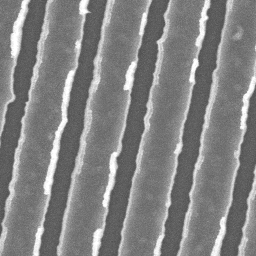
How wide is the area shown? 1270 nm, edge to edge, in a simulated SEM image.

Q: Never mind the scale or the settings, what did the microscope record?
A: parallel lines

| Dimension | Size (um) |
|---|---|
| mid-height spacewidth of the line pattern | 0.0962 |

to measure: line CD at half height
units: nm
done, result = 198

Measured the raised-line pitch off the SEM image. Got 59.4 pixels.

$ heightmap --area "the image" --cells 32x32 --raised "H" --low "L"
HHHLLLHHHHHLLHHHHHHLLHHHHHLLHHHH
HHHLLLHHHHHLLHHHHHLLLHHHHHLLHHHH
HHHLLLHHHHHLLHHHHHLLLHHHHHLLHHHH
HHHLLHHHHHLLLHHHHHLLLHHHHHLLHHHH
HHHLLHHHHHLLLHHHHHLLHHHHHHLLHHHH
HHLLLHHHHHLLLHHHHHLLHHHHHLLLHHHH
HHLLLHHHHHLLHHHHHLLLHHHHHLLHHHHH
HHLLLHHHHHLLHHHHHLLLHHHHHLLHHHHH
HHLLHHHHHHLLHHHHHLLHHHHHHLLHHHHH
HHLLHHHHHLLLHHHHHLLHHHHHLLLHHHHH
HHLLHHHHHLLLHHHHHLLHHHHHLLLHHHHH
HHLLHHHHHLLHHHHHLLLHHHHHLLHHHHHH
HHLLHHHHHLLHHHHHLLLHHHHHLLHHHHHL
HLLHHHHHLLLHHHHHLLHHHHHHLLHHHHHL
HLLHHHHHLLLHHHHHLLHHHHHLLLHHHHHL
LLLHHHHHLLLHHHHHLLHHHHHLLLHHHHHL
LLLHHHHHLLHHHHHLLLHHHHHLLHHHHHHL
LLHHHHHLLLHHHHHLLLHHHHHLLHHHHHLL
LLHHHHHLLLHHHHHLLHHHHHHLLHHHHHLL
LLHHHHHLLLHHHHHLLHHHHHLLLHHHHHLL
LLHHHHHLLLHHHHLLLHHHHHLLLHHHHHLL
LLHHHHHLLHHHHHLLLHHHHHLLHHHHHLLL
LHHHHHHLLHHHHHLLLHHHHHLLHHHHHLLL
LHHHHHLLLHHHHHLLHHHHHLLLHHHHHLLL
LHHHHHLLLHHHHHLLHHHHHLLLHHHHHLLH
LHHHHHLLHHHHHLLLHHHHHLLLHHHHHLLH
LHHHHHLLHHHHHLLLHHHHHLLHHHHHLLLH
HHHHHLLLHHHHHLLLHHHHHLLHHHHHLLLH
HHHHHLLLHHHHHLLHHHHHLLLHHHHHLLHH
HHHHHLLLHHHHHLLHHHHHLLLHHHHHLLHH
HHHHHLLLHHHHLLLHHHHHLLLHHHHHLLHH
HHHHHLLHHHHHLLLHHHHHLLHHHHHLLLHH